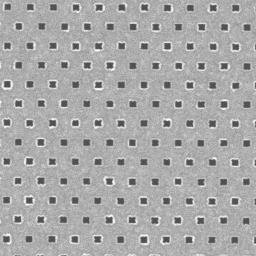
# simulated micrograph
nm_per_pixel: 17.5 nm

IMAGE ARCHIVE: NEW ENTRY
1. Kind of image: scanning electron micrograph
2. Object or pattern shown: a regular array of holes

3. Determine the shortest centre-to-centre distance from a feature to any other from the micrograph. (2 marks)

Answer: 22.1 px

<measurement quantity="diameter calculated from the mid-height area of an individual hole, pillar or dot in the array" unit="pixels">7.65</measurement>